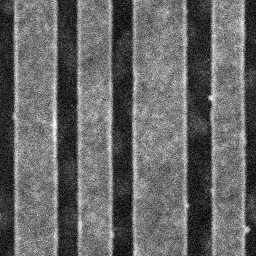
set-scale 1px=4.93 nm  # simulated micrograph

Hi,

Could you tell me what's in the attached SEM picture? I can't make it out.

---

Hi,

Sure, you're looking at one or a few lines or trenches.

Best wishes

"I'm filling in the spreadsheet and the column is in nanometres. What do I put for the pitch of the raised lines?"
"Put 316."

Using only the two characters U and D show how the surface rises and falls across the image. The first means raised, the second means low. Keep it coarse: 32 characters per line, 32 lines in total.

DDUUUUUDDDUUUUDDDUUUUUUDDDDUUUDD
DDUUUUUDDDUUUUDDDUUUUUUDDDDUUUDD
DDUUUUUDDDUUUUDDDUUUUUUDDDDUUUDD
DDUUUUUDDDUUUUDDDUUUUUUDDDDUUUDD
DDUUUUUDDDUUUUDDDUUUUUUDDDDUUUDD
DDUUUUUDDDUUUUDDDUUUUUUDDDDUUUDD
DDUUUUUDDDUUUUDDDUUUUUUDDDDUUUDD
DDUUUUUDDDUUUUDDDUUUUUUDDDDUUUDD
DDUUUUUDDDUUUUDDDUUUUUUDDDDUUUDD
DDUUUUUDDDUUUUDDDUUUUUUDDDDUUUDD
DDUUUUUDDDUUUUDDDUUUUUUDDDDUUUDD
DDUUUUUDDDUUUUDDDUUUUUUDDDDUUUDD
DDUUUUUDDDUUUUDDDUUUUUUDDDUUUUDD
DDUUUUUDDDUUUUDDDUUUUUUDDDDUUUDD
DDUUUDUDDDUUUUDDDUUUUUUDDDUUUUDD
DDUUUUDDDDUUUUDDDUUUUUUDDDUUUUDD
DDUUUUUDDDUUUUDDDUUUUUUDDDDUUUUD
DDUUUUUDDDUUUUDDDUUUUUUDDDDUUUUD
DDUUUUUDDDUUUUDDDUUUUUUDDDDUUUUD
DDUUUUUDDDUUUUDDDUUUUUUDDDDUUUDD
DDUUUUUDDDUUUUDDDUUUUUUDDDDUUUUD
DDUUUUUDDDUUUUDDDUUUUUUDDDDUUUUD
DDUUUUUDDDUUUUDDDUUUUUUDDDDUUUUD
DDUUUUUDDDUUUUDDDUUUUUUDDDDUUUUD
DDUUUUUDDDUUUUDDDUUUUUUDDDDUUUDD
DDUUUUUDDDUUUUDDDUUUUUUDDDDUUUDD
DDUUUUUDDDUUUUDDDUUUUUUDDDDUUUDD
DDUUUUUDDDUUUUDDDUUUUUUDDDDUUUDD
DDUUUUUDDDDUUUDDDUUUUUUDDDDUUUUD
DDUUUUUDDDUUUUDDDUUUUUUDDDDUUUUD
DDUUUUUDDDUUUUDDDUUUUUUDDDDUUUDD
DDUUUUUDDDUUUUDDDUUUUUUDDDDUUUDD